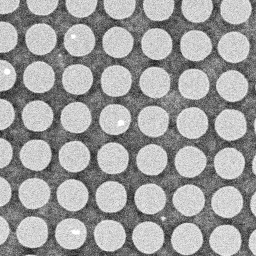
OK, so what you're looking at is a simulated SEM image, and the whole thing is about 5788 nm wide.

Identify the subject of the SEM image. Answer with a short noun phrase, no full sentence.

an array of small figures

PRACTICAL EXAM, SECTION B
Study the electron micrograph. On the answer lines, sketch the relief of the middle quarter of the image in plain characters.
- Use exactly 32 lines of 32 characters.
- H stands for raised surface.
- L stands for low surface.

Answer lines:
LLHHHLLLLLLLLLLLLLLLLLLLLLLLLLLL
HHHHHHLLLLHHHHHHLLLLHHHHHLLLLLLH
HHHHHHHLLLHHHHHHHLLLHHHHHHLLLLHH
HHHHHHHLLHHHHHHHHLLHHHHHHHLLLHHH
HHHHHHHLLHHHHHHHHLLHHHHHHHLLLHHH
HHHHHHHLLLHHHHHHHLLHHHHHHHLLLHHH
LHHHHHLLLLHHHHHHLLLLHHHHHHLLLHHH
LLLHLLLLLLLHHHHLLLLLHHHHHLLLLHHH
LLLLLLLLLLLLLLLLLLLLLLLLLLLLLLLH
LLLLLLLLLLLLLLLLLLLLLLLLLLLLLLLL
LHHHHLLLLLLHHHLLLLLLLLLLLLLLLLLL
HHHHHHLLLLHHHHHHLLLLHHHHHLLLLLHH
HHHHHHHLLHHHHHHHLLLHHHHHHHLLLHHH
HHHHHHHLLHHHHHHHHLLHHHHHHHLLLHHH
HHHHHHHLLHHHHHHHLLLHHHHHHHLLHHHH
HHHHHHLLLHHHHHHHLLLHHHHHHHLLHHHH
LHHHHLLLLLHHHHHHLLLHHHHHHLLLLHHH
LLLLLLLLLLLLHHLLLLLLHHHHHLLLLHHH
LLLLLLLLLLLLLLLLLLLLLLLLLLLLLLLL
LLHHLLLLLLLLLLLLLLLLLLLLLLLLLLLL
HHHHHLLLLLHHHHLLLLLLLHHLLLLLLLLL
HHHHHHLLLHHHHHHLLLLHHHHHHLLLLHHH
HHHHHHLLLHHHHHHHLLLHHHHHHLLLHHHH
HHHHHHLLLHHHHHHHLLHHHHHHHHLLHHHH
HHHHHHLLLHHHHHHHLLHHHHHHHHLLHHHH
HHHHHHLLLHHHHHHHLLHHHHHHHLLLHHHH
LHHHLLLLLLHHHHHLLLLHHHHHHLLLHHHH
LLLLLLLLLLLLLLLLLLLLLHHLLLLLLHHH
LLLLLLLLLLLLLLLLLLLLLLLLLLLLLLLL
HHHHLLLLLLLLLLLLLLLLLLLLLLLLLLLL
HHHHHLLLLHHHHHHLLLLLHHHLLLLLLLHH
HHHHHHLLHHHHHHHLLLHHHHHHHLLLHHHH